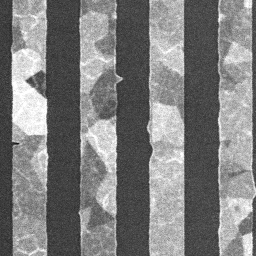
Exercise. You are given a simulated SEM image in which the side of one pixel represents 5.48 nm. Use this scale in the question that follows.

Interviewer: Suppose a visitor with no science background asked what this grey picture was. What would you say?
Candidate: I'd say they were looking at one or a few lines or trenches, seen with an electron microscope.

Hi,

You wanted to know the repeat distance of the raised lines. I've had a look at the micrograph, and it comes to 377 nanometres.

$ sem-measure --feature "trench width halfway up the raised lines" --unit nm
191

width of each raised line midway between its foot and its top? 0.186 um